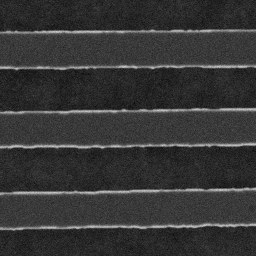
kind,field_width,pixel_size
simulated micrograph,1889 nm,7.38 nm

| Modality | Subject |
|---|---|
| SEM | lines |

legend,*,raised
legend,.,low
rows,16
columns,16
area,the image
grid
................
................
****************
****************
................
................
................
****************
****************
................
................
................
****************
****************
................
................